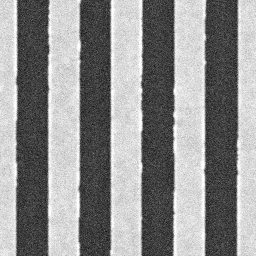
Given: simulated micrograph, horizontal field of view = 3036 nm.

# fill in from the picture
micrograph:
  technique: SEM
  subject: lines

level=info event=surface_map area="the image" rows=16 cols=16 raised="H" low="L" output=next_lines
HLLHHLLHHLLHHLLH
HLLHHLLHHLLHHLLH
HLLHHLLHHLLHHLLH
HLLHHLLHHLLHHLLH
HLLHHLLHHLLHHLLH
HLLHHLLHHLLHHLLH
HLLHHLLHHLLHHLLH
HLLHHLLHHLLHHLLH
HLLHHLLHHLLHHLLH
HLLHHLLHHLLHHLLH
HLLHHLLHHLLHHLLH
HLLHHLLHHLLHHLLH
HLLHHLLHHLLHHLLH
HLLHHLLHHLLHHLLH
HLLHHLLHHLLHHLLH
HLLHHLLHHLLHHLLH